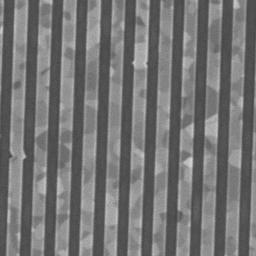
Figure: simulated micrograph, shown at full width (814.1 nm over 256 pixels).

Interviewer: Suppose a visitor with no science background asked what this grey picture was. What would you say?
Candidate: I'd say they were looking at parallel lines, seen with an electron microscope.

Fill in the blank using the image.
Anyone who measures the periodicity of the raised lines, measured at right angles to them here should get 77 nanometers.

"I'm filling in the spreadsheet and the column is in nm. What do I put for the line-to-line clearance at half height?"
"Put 37.7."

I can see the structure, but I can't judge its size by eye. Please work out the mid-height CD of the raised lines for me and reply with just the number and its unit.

40.5 nanometres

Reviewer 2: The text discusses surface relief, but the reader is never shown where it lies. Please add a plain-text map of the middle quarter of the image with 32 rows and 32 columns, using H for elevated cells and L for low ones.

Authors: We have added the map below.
HHHLLLHHLLLLHHHLLLHHHLLLHHHLLLHH
HHHLLHHHLLLLHHHLLLHHHLLLHHHLLLHH
HHLLLHHHLLLLHHHLLLHHLLLLHHHLLLHH
HHLLLHHHLLLLHHHLLLHHLLLLHHHLLLHH
HHLLLHHHLLLLHHHLLLHHLLLLHHHLLLHH
HHLLLHHHLLLLHHLLLLHHLLLLHHHLLLHH
HHLLLHHHLLLHHHLLLLHHLLLLHHHLLLHH
HHLLLHHHLLLHHHLLLLHHLLLLHHLLLLHH
HHLLLHHHLLLHHHLLLLHHLLLHHHLLLLHH
HHLLLHHHLLLHHHLLLLHHLLLHHHLLLLHH
HHLLLHHHLLLHHHLLLHHHLLLHHHLLLLHH
HHLLLHHHLLLHHHLLLHHHLLLHHHLLLLHH
HHLLLHHHLLLHHHLLLHHHLLLHHHLLLHHH
HHLLLHHHLLLHHHLLLHHHLLLHHHLLLHHH
HHLLLHHHLLLHHHLLLHHHLLLHHHLLLHHH
HHLLLHHHLLLHHHLLLHHHLLLHHHLLLHHH
HHLLLHHHLLLHHHLLLHHHLLLHHHLLLHHH
HHLLLHHHLLLHHHLLLHHHLLLHHHLLLHHH
HHLLLHHHLLLHHHLLLHHHLLLHHHLLLHHH
HHLLLHHHLLLHHHLLLHHHLLLHHHLLLHHH
HHLLLHHHLLLHHHLLLHHHLLLHHHLLLHHH
HHLLLHHHLLLHHHLLLHHHLLLHHHLLLHHH
HHLLLHHHLLLHHHLLLHHHLLLHHHLLLHHH
HHLLLHHHLLLHHHLLLHHHLLLHHHLLLHHH
HHLLLHHHLLLHHHLLLHHHLLLHHHLLLHHH
HLLLLHHHLLLHHHLLLHHHLLLHHHLLLHHH
HHLLLHHHLLLHHHLLLHHHLLLHHHLLLHHH
HHLLLHHHLLLHHHLLLHHHLLLHHHLLLHHH
HHLLLHHHLLLHHHLLLHHHLLLHHHLLLHHH
HHLLLHHHLLLHHHLLLHHHLLLHHHLLLHHH
HHLLLHHLLLLHHHLLLHHHLLLHHHLLLHHH
HHLLHHHLLLLHHHLLLHHHLLLHHHLLLHHH